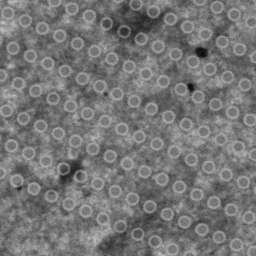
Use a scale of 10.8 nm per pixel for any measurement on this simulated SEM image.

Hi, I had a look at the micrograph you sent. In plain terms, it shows a regular array of raised bodies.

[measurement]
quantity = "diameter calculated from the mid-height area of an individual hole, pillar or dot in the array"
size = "125 nm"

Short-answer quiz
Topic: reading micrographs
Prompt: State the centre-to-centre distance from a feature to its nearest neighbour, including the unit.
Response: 203 nm